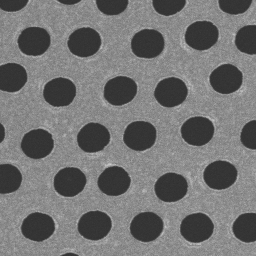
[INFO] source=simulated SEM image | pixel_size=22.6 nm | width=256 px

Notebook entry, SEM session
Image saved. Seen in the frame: a regular array of holes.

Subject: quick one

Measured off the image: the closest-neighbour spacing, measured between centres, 1100 nanometres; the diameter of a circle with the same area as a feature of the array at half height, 718 nanometers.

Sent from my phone